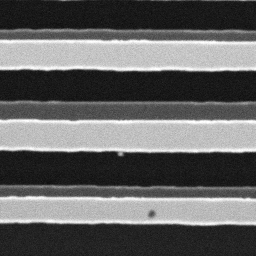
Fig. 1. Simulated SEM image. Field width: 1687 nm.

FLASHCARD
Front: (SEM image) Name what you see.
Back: lines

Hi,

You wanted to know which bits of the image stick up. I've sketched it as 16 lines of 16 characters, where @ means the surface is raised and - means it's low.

----------------
----------------
@@@@@@@@@@@@@@@@
@@@@@@@@@@@@@@@@
----------------
----------------
@@@@@@@@@@@@@@@@
@@@@@@@@@@@@@@@@
@@@@@@@@@@@@@@@@
---------@@@@@@@
----------------
----------------
@@@@@@@@@@@@@@@@
@@@@@@@@@@@@@@@@
----------------
----------------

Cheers